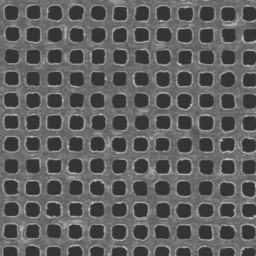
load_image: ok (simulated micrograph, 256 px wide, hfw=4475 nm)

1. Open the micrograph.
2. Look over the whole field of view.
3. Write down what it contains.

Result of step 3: a regular array of holes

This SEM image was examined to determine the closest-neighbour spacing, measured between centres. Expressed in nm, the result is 372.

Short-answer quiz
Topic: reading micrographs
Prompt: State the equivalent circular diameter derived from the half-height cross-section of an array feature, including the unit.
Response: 267 nanometres